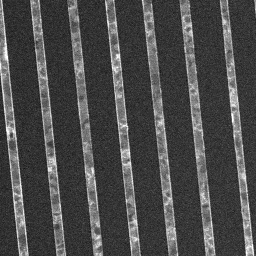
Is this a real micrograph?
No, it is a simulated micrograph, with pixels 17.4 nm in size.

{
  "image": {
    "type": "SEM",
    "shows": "parallel lines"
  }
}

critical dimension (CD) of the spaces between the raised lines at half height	496	nm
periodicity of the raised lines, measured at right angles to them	37.5	pixels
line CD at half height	151	nm